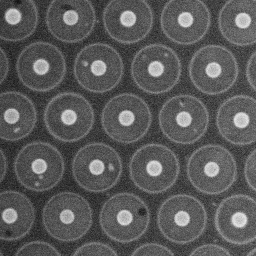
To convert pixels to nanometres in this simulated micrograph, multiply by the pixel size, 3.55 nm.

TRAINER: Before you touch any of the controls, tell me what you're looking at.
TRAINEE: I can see an array of small figures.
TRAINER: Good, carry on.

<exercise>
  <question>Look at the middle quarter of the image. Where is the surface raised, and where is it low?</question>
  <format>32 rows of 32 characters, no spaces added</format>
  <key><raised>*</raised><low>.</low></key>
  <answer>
***....***..*****....****....***
***....***....***....****....***
***.....**....***.....**.....***
***...........****..........****
****.........*****..........****
*****.......*******........*****
*******...***********....*******
*.******************************
....*********.....**********....
......******........******......
......*****.........*****.......
.......***...........****.......
***....***....***....***.....**.
***....***....***....***....****
**.....***....***....***....****
.......***...........***........
......****...........****.......
.....******..*......******......
....*********.**...********.....
***************.*************..*
******....***********...********
****........*******.......******
****.........*****.........*****
***.*.........***...........****
*****..**.....***.....*.....***.
**.....***.*..***....***....***.
**.....***.*..***....***....***.
***.....*.....***....***....***.
***..........****...........****
****....**...*****.........*****
*****...**..*******.......******
********************.....*******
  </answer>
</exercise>